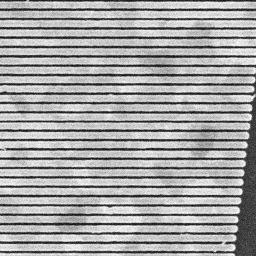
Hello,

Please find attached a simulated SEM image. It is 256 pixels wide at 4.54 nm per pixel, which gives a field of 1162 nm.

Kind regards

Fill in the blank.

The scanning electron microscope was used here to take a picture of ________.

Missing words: parallel lines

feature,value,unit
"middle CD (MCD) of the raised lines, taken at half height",27.8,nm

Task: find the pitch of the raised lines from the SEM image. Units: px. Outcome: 9.32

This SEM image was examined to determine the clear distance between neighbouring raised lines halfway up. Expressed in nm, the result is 15.9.